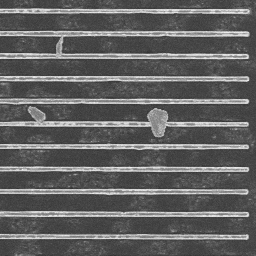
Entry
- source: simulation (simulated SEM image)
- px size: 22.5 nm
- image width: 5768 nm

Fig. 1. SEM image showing parallel lines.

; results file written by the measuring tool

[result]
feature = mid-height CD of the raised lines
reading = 87.3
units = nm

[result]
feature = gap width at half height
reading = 417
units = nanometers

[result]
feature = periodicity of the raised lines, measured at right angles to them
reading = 22.5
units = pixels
